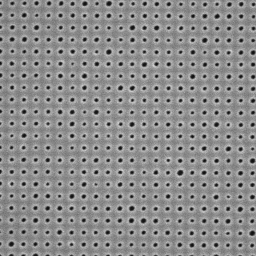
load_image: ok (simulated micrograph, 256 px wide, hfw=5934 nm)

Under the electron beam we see a regular array of holes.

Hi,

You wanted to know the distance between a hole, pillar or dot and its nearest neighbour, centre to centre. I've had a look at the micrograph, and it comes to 272 nanometres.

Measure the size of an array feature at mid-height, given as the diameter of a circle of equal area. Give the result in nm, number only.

101